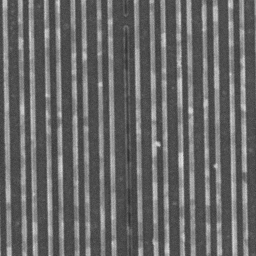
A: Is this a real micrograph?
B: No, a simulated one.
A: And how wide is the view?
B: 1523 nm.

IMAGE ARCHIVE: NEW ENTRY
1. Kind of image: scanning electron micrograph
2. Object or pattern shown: parallel lines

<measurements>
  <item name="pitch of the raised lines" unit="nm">78.1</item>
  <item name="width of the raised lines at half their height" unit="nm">20.8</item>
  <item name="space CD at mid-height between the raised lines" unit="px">11.1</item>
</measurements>